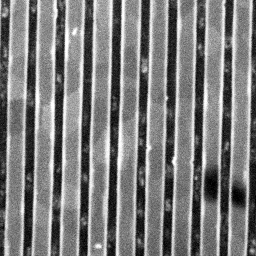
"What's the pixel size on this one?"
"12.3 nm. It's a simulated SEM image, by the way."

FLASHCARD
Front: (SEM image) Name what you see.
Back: parallel lines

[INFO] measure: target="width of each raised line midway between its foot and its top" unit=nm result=222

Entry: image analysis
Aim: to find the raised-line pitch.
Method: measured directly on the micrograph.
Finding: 343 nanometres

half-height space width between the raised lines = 0.118 microns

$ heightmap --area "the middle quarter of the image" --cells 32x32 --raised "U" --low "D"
UUUUUDDUUUUUDDUUUUUDDDUUUUDDUUUU
UUUUUDDUUUUUDDUUUUUDUUUUUUDDUUUU
UUUUUDDUUUUUDDUUUUUDDUUUUUDDUUUU
UUUUDDDUUUUUDDUUUUUDDUUUUDDDUUUU
UUUUDDDUUUUUDDUUUUUDDUUUUDDDUUUU
UUUUDDDUUUUUDDUUUUUDDUUUUDDDUUUU
UUUUDDDUUUUUDDUUUUUDDUUUUDDDUUUU
UUUUDDDUUUUUDDUUUUDDDUUUUDDDUUUU
UUUUDDDUUUUUDDUUUUDDDUUUUUDDUUUU
UUUUDDDUUUUDDDUUUUDDDUUUUDDDUUUU
UUUUDDDUUUUDDDUUUUDDDUUUUDDDUUUU
UUUUDDDUUUUDDDUUUUDDDUUUUDDDUUUU
UUUUDDDUUUUDDDUUUUDDDUUUUDDDUUUU
UUUUDDDUUUUDDDUUUUDDDUUUUDDDUUUU
UUUUDDDUUUUDDDUUUUDDDUUUUDDDUUUU
UUUUDDDUUUUDDDUUUUDDDUUUUDDDUUUU
UUUUDDDUUUUDDDUUUUDDDUUUUDDDUUUU
UUUUDDDUUUUDDDUUUUDDDUUUUDDDUUUU
UUUUDDDUUUUDDDUUUUDDDUUUUDDDUUUU
UUUUDDDUUUUDDDUUUUDDDUUUUDDDUUUU
UUUUDDDUUUUDDDUUUUDDDUUUUDDDUUUU
UUUUDDDUUUUDDDUUUUDDDUUUUDDDUUUU
UUUUDDDUUUUDDDUUUUDDDUUUUDDDUUUU
UUUUDDDUUUUDDDUUUUDDDUUUUDDDUUUU
UUUUDDDUUUUDDDUUUUDDDUUUUDDUUUUU
UUUUDDDUUUUDDDUUUUDDDUUUUDDDUUUU
UUUUDDDUUUUDDUUUUUDDDUUUUDDDUUUU
UUUUDDDUUUUDDUUUUUDDDUUUUDDDUUUU
UUUUDDDUUUUDDUUUUUDDDUUUUDDDUUUU
UUUUDDUUUUUDDUUUUUDDDUUUUDDDUUUU
UUUUDDUUUUUDDUUUUUDDDUUUUDDDUUUU
UUUUDDUUUUUDDUUUUUDDDUUUUDDDUUUU